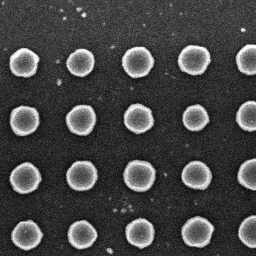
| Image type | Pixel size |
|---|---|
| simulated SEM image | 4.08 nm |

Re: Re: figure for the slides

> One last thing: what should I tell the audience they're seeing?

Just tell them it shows a regular array of raised bodies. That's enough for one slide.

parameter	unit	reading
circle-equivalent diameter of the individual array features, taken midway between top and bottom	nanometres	114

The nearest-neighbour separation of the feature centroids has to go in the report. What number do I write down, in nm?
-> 230